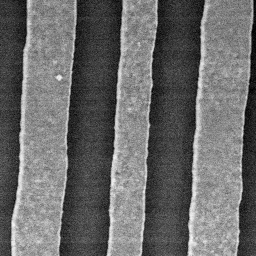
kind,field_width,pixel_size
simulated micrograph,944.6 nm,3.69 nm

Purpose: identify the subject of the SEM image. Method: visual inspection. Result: lines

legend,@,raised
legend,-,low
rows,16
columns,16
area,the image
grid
--@@@---@@---@@@
--@@@---@@---@@@
--@@@---@@---@@@
--@@@---@@---@@@
-@@@---@@---@@@@
-@@@---@@@--@@@-
-@@@---@@---@@@-
-@@@---@@---@@@-
-@@@---@@---@@@-
-@@@---@@---@@@-
-@@@---@@---@@@-
-@@@---@@---@@@-
-@@@---@@---@@@-
-@@@---@@---@@@-
-@@@---@@---@@@-
-@@@---@@---@@@-